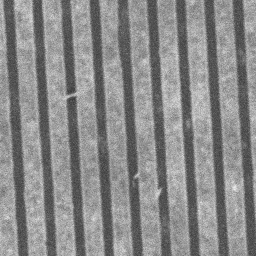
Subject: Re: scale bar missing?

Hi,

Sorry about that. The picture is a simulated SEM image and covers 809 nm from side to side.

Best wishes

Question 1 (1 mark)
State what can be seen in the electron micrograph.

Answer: parallel lines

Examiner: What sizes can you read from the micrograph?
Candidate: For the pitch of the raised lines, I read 90.4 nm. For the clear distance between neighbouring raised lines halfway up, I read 37.9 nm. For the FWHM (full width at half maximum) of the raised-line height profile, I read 53.7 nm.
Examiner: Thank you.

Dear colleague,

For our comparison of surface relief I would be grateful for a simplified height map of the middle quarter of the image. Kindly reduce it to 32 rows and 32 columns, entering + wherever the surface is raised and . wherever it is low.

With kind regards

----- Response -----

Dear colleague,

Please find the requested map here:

...++++...++++...++++...++++...+
...++++...++++...++++...+++++...
...++++...++++...++++....++++...
...++++...++++...++++....++++...
...++++...++++...+++++...++++...
...++++...++++...+++++...++++...
...++++....++++...++++...++++...
+..++++....++++...++++...++++...
+..++++....++++...++++...++++...
...++++....++++...++++...++++...
+..+++++...++++...++++...++++...
+...++++...++++...++++...++++...
+...++++...++++...++++...++++...
....++++...++++...++++...++++...
+...++++...++++...++++...++++...
+...++++...++++...++++...++++...
+...++++...++++...++++...++++...
+...++++...++++...++++...++++...
+...++++...++++...++++...+++++..
+...++++...++++...++++....++++..
+...++++...++++...+++++...++++..
+...++++...++++...+++++...++++..
+...++++...++++...+++++...++++..
+...++++....++++...++++...++++..
+...++++....++++...++++...++++..
+...++++....++++...++++...++++..
+...++++....++++...++++...++++..
++..+++++...++++..+++++...++++..
++...++++...++++...++++...++++..
++...++++...++++...++++...++++..
+....++++...++++...++++...++++..
++...++++...++++...++++...++++..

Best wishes